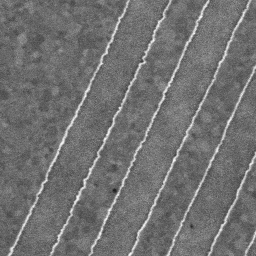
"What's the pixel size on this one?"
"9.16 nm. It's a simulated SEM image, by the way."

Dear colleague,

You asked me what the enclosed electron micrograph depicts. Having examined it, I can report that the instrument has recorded one or a few lines or trenches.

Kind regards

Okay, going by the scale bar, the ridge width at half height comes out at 319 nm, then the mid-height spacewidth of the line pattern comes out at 334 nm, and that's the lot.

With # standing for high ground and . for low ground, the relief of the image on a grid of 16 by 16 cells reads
########..###..#
#######...##...#
#######..###..##
#######..##...##
######...##...##
######..##...##.
#####...##...##.
#####..###..##..
####...##...##..
####..###..###..
###...##...##...
###..###..###..#
##...##...##...#
##..###..###..##
#...##...##...##
#..###..###..###